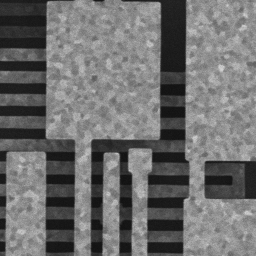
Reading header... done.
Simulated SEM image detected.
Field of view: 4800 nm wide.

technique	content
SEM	wiring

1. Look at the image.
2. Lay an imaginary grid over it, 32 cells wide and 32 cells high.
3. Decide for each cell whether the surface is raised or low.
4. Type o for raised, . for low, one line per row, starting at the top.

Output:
......oooooooooooooo...ooooooooo
......oooooooooooooo...ooooooooo
......oooooooooooooo...ooooooooo
......oooooooooooooo...ooooooooo
......oooooooooooooo...ooooooooo
......oooooooooooooo...ooooooooo
......oooooooooooooo...ooooooooo
......oooooooooooooo...ooooooooo
......oooooooooooooo...ooooooooo
......oooooooooooooo...ooooooooo
......oooooooooooooo...ooooooooo
......oooooooooooooo...ooooooooo
......oooooooooooooo...ooooooooo
......oooooooooooooo...ooooooooo
......oooooooooooooo...ooooooooo
......oooooooooooooo...ooooooooo
......oooooooooooooo...ooooooooo
.........ooo...........ooooooooo
.........oo............ooooooooo
.ooooo...oo..oo.ooo....ooooooooo
.ooooo...oo..oo.ooo.....oo......
.ooooo...oo..oo.ooo.....o.......
.ooooo...oo..oo..o......o.......
.ooooo...oo..oo..o......o.......
.ooooo...oo..oo..o.....ooo......
.ooooo...oo..oo..o.....ooooooooo
.ooooo...oo..oo..o.....ooooooooo
.ooooo...oo..oo..o.....ooooooooo
.ooooo...oo..oo..o.....ooooooooo
.ooooo...oo..oo..o.....ooooooooo
.ooooo...oo..oo..o.....ooooooooo
.ooooo...oo..oo..o.....ooooooooo